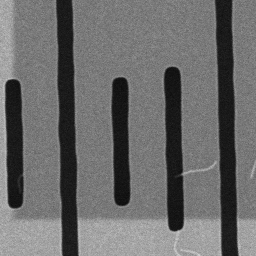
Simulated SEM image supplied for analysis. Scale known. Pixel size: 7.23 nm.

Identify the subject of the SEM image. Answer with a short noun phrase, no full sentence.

groups of lines, slits or small figures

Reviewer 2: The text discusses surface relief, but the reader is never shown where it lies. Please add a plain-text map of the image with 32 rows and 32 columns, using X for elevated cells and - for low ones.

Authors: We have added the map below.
XXXXXXX--XXXXXXXXXXXXXXXXXX--XXX
XXXXXXX--XXXXXXXXXXXXXXXXXX--XXX
XXXXXXX--XXXXXXXXXXXXXXXXXX--XXX
XXXXXXX--XXXXXXXXXXXXXXXXXX--XXX
XXXXXXX--XXXXXXXXXXXXXXXXXX--XXX
XXXXXXX--XXXXXXXXXXXXXXXXXX--XXX
XXXXXXX--XXXXXXXXXXXXXXXXXX--XXX
XXXXXXX--XXXXXXXXXXXXXXXXXX--XXX
XXXXXXX--XXXXXXXXXXXX-XXXXX--XXX
XXXXXXX--XXXXXXXXXXX--XXXXX--XXX
X-XXXXX--XXXXX--XXXX---XXXX--XXX
X--XXXX--XXXXX--XXXXX--XXXX--XXX
X--XXXX--XXXXX--XXXXX--XXXX--XXX
X--XXXX--XXXXX--XXXXX--XXXX--XXX
X--XXXX--XXXXX--XXXXX--XXXX--XXX
X--XXXX--XXXXX--XXXXX--XXXX--XXX
X--XXXX--XXXXX--XXXXX--XXXX--XXX
X--XXXX--XXXXX--XXXXX--XXXX--XXX
X--XXXX--XXXXX--XXXXX--XXXX--XXX
X--XXXX---XXXX--XXXXX--XXXX--XXX
X--XXXX---XXXX--XXXXX--XXXX---XX
X--XXXX---XXXX--XXXXX--XXXX--XXX
X--XXXX---XXXX--XXXXX--XXXX---XX
X--XXXX---XXXX--XXXXX--XXXX---XX
X--XXXXX--XXXX--XXXXX--XXXX---XX
X--XXXXX--XXXXX-XXXXX--XXXXX--XX
XXXXXXXX--XXXXXXXXXXX--XXXXX--XX
XXXXXXXX--XXXXXXXXXXX--XXXXX--XX
XXXXXXXX--XXXXXXXXXXX--XXXXX--XX
XXXXXXXX--XXXXXXXXXXXXXXXXXX--XX
XXXXXXXX--XXXXXXXXXXXXXXXXXX--XX
XXXXXXXX--XXXXXXXXXXXXXXXXXX--XX